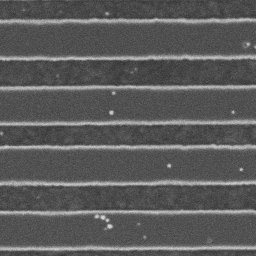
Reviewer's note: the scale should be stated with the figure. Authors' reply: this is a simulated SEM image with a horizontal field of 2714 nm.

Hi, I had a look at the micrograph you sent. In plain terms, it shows lines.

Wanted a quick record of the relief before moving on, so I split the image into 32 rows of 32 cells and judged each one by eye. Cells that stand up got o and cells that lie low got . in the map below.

................................
................................
...................o..........oo
oooooooooooooooooooooooooooooooo
oooooooooooooooooooooooooooooooo
oooooooooooooooooooooooooooooooo
oooooooooooooooooooooooooooooooo
................................
................................
................................
................................
oooooooooooooooooooooooooooooooo
oooooooooooooooooooooooooooooooo
oooooooooooooooooooooooooooooooo
oooooooooooooooooooooooooooooooo
ooooooooooo.o...................
................................
................................
oooooooooooooooooooooooooooooooo
oooooooooooooooooooooooooooooooo
oooooooooooooooooooooooooooooooo
oooooooooooooooooooooooooooooooo
oooooooooooooooooooooooooooooooo
................................
................................
................................
o.oo.....ooooooooooooooooooooooo
oooooooooooooooooooooooooooooooo
oooooooooooooooooooooooooooooooo
oooooooooooooooooooooooooooooooo
oooooooooooooooooooooooooooooooo
................................